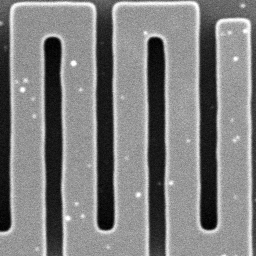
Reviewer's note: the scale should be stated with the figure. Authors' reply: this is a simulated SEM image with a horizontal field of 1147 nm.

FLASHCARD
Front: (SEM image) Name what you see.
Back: groups of lines, slits or small figures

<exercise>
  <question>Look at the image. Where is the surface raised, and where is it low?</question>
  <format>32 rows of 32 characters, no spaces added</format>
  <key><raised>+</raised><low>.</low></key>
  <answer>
..+++++++++....++++++++++.......
.+++++++++++..+++++++++++.......
.+++++++++++..+++++++++++...+++.
.+++++++++++..+++++++++++..++++.
.+++++++++++..+++++++++++..++++.
.+++++..++++..++++..+++++..++++.
.++++...++++..++++...++++..++++.
.+++++..++++..++++...++++..++++.
.+++++..++++..++++...++++..++++.
.+++++..++++..++++...++++..++++.
.+++++..++++..++++...++++..++++.
.+++++..++++..++++...++++..++++.
.+++++..++++..++++...++++..++++.
.+++++..++++..++++...++++..++++.
.+++++..++++..++++...++++..++++.
.+++++..++++..++++...++++..++++.
.+++++..++++..++++...++++..++++.
.+++++..++++..++++...++++..++++.
.+++++..++++..++++...++++..++++.
.+++++..++++..++++...++++..++++.
.+++++..++++..++++...++++..++++.
.+++++..++++..+++++..++++..++++.
.+++++..++++..+++++..++++..++++.
.+++++..++++..+++++..++++..++++.
.+++++..++++..+++++..++++..++++.
.+++++..++++..+++++..++++..++++.
.+++++..++++..+++++..++++..++++.
.+++++..++++..+++++..++++..++++.
.+++++..++++..+++++..++++..++++.
++++++..+++++++++++..++++++++++.
++++++..+++++++++++..++++++++++.
++++++..+++++++++++..++++++++++.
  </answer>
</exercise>